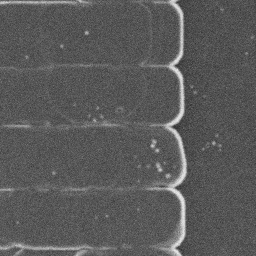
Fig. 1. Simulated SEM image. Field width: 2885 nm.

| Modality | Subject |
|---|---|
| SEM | wiring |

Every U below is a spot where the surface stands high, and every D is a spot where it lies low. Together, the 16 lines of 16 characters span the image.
UUUUUUUUUUUDDDDD
UUUUUUUUUUUDDDDD
UUUUUUUUUUUDDDDD
UUUUUUUUUUUDDDDD
UUUUUUUUUUUDDDDD
UUUUUUUUUUUDDDDD
UUUUUUUUUUUDDDDD
UUUUUUUUUUUDDDDD
UUUUUUUUUUUDDDDD
UUUUUUUUUUUDDDDD
UUUUUUUUUUUUDDDD
UUUUUUUUUUUDDDDD
UUUUUUUUUUUDDDDD
UUUUUUUUUUUDDDDD
UUUUUUUUUUUDDDDD
UUUUUUUUUUUDDDDD